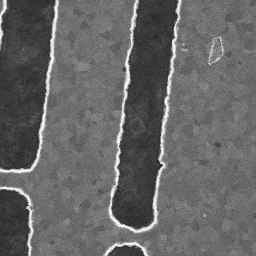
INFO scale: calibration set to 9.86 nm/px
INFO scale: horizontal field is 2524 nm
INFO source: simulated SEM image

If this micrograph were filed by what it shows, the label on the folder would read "one or a few lines or trenches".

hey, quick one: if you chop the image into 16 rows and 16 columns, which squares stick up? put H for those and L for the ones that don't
LLLLHHHHLLLHHHHH
LLLHHHHHLLLHHHHH
LLLHHHHHLLLHHHHH
LLLHHHHHLLLHHHHH
LLLHHHHHLLLHHHHH
LLLHHHHHLLLHHHHH
LLLHHHHHLLHHHHHH
LLLHHHHHLLHHHHHH
LLLHHHHLLLHHHHHH
LLHHHHHLLLHHHHHH
LLHHHHHLLLHHHHHH
HHHHHHHLLLHHHHHH
LLHHHHHLLLHHHHHH
LLHHHHHLLLHHHHHH
LLHHHHHHHHHHHHHH
LLHHHHHLLHHHHHHH